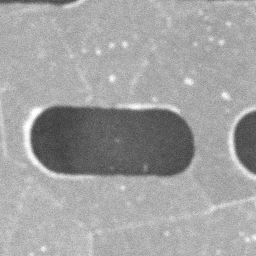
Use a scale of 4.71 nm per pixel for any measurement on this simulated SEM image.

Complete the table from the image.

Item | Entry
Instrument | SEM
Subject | holes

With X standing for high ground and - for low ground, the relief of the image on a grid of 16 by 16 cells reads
XXXXXXXXXXXXXXXX
XXXXXXXXXXXXXXXX
XXXXXXXXXXXXXXXX
XXXXXXXXXXXXXXXX
XXXXXXXXXXXXXXXX
XXXXXXXXXXXXXXXX
XXXXXXXXXXXXXXXX
XX----------XXX-
XX----------XXX-
XX----------XXX-
XXX---------XXX-
XXXXXXXXXXXXXXXX
XXXXXXXXXXXXXXXX
XXXXXXXXXXXXXXXX
XXXXXXXXXXXXXXXX
XXXXXXXXXXXXXXXX